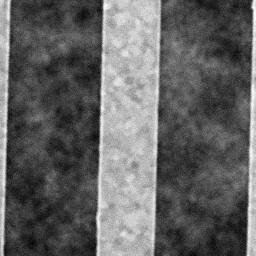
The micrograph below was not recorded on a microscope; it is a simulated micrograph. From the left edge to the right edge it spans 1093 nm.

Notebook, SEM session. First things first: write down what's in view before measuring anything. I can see one or a few lines or trenches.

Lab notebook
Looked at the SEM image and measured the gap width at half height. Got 404 nm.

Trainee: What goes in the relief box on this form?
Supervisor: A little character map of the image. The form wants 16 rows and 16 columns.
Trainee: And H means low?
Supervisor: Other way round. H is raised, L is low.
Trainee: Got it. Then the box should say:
HLLLLLLHHHLLLLLL
HLLLLLHHHHLLLLLL
HLLLLLHHHHLLLLLL
LLLLLLHHHHLLLLLL
LLLLLLHHHHLLLLLL
LLLLLLHHHHLLLLLL
LLLLLLHHHHLLLLLL
LLLLLLHHHHLLLLLL
LLLLLLHHHHLLLLLL
LLLLLLHHHHLLLLLL
LLLLLLHHHHLLLLLL
LLLLLLHHHHLLLLLL
LLLLLLHHHHLLLLLL
LLLLLLHHHHLLLLLL
LLLLLLHHHHLLLLLL
LLLLLLHHHHLLLLLL